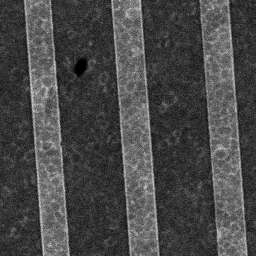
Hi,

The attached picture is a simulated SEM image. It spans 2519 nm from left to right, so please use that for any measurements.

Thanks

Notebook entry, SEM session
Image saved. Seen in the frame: one or a few lines or trenches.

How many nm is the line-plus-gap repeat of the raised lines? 867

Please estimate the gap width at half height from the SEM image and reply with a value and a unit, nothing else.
60.5 px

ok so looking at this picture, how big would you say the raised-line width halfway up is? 277 nanometers